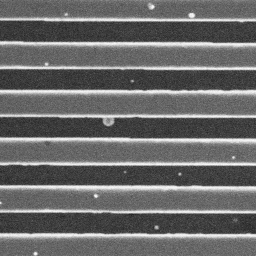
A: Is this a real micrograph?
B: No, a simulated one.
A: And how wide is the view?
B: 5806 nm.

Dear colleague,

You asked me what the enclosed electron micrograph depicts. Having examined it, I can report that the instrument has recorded lines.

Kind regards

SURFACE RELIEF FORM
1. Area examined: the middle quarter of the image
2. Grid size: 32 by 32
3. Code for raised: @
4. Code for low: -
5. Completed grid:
@@@@@@@@@@@@@@@@@@@@@@@@@@@@@@@@
--------------------------------
--------------------------------
--------------------------------
--------------------------------
--------------------------------
--------------------------------
@@@@@@@@@@@@@@@@@@@@@@@@@@@@@@@@
@@@@@@@@@@@@@@@@@@@@@@@@@@@@@@@@
@@@@@@@@@@@@@@@@@@@@@@@@@@@@@@@@
@@@@@@@@@@@@@@@@@@@@@@@@@@@@@@@@
@@@@@@@@@@@@@@@@@@@@@@@@@@@@@@@@
@@@@@@@@@@@@@@@@@@@@@@@@@@@@@@@@
--------------------------------
--------------------------------
--------------------------------
--------------------------------
--------------------------------
--------------------------------
@@@@@@@@@@@@@@@@@@@@@@@@@@@@@@@@
@@@@@@@@@@@@@@@@@@@@@@@@@@@@@@@@
@@@@@@@@@@@@@@@@@@@@@@@@@@@@@@@@
@@@@@@@@@@@@@@@@@@@@@@@@@@@@@@@@
@@@@@@@@@@@@@@@@@@@@@@@@@@@@@@@@
@@@@@@@@@@@@@@@@@@@@@@@@@@@@@@@@
--------------------------------
--------------------------------
--------------------------------
--------------------------------
--------------------------------
--------------------------------
@@@@@@@@@@@@@@@@@@@@@@@@@@@@@@@@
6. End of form